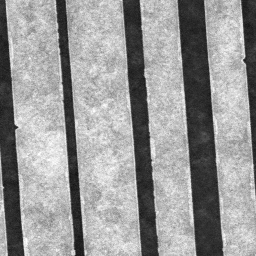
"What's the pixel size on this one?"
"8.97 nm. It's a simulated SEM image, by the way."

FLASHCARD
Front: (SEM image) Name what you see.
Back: one or a few lines or trenches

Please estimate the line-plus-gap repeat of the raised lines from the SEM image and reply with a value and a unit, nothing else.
572 nanometres